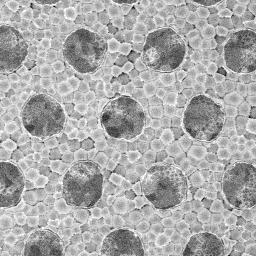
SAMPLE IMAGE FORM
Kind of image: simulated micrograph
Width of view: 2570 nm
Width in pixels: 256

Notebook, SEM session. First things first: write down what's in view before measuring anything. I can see raised bodies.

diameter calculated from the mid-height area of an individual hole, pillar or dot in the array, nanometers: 443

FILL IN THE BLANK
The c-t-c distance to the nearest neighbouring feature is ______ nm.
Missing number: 783